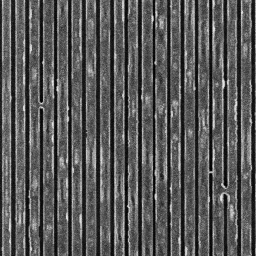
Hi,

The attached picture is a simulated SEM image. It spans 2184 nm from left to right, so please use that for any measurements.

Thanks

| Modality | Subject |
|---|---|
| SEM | parallel lines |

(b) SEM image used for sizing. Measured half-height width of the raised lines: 0.0885 um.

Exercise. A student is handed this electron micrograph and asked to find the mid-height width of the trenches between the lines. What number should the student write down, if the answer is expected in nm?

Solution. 33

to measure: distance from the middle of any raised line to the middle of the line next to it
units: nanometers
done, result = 120